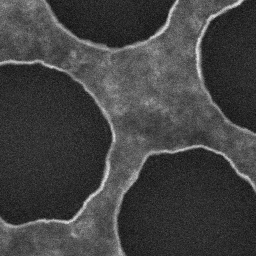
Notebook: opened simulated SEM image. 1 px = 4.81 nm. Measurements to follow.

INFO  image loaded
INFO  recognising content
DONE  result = holes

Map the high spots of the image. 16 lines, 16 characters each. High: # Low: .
###........###..
####......###...
#####....####...
#############...
....#########...
.....########...
......#######...
.......#######..
.......#########
.......####..###
.......##......#
......##........
.....###........
.....##.........
#######.........
########........